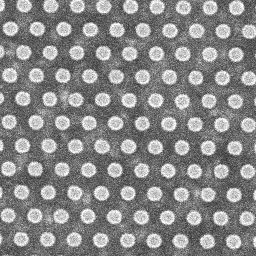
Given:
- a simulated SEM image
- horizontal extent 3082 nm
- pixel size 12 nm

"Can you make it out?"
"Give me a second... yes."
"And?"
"a regular array of raised bodies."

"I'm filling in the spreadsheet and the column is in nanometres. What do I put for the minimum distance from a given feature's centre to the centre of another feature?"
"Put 318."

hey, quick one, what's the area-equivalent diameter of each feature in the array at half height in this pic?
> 161 nanometres